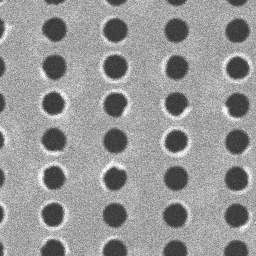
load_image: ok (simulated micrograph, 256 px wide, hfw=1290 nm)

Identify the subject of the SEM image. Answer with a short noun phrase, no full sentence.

a regular array of holes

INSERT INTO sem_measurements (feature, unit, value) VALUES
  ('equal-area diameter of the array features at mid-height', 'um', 0.123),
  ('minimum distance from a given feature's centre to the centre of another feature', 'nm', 184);